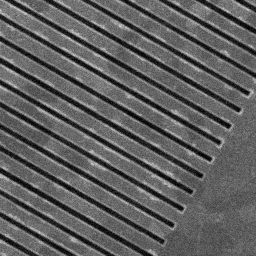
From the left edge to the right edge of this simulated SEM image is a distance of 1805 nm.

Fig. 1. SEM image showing parallel lines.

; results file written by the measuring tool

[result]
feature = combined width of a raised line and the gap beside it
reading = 0.134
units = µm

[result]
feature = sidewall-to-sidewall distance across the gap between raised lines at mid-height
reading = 41.3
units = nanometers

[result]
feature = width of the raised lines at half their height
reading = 88.6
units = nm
